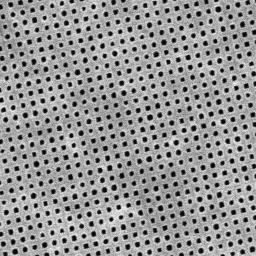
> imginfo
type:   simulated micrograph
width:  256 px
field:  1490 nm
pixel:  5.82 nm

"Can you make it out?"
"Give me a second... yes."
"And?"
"a regular array of holes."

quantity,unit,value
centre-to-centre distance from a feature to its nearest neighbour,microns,0.0572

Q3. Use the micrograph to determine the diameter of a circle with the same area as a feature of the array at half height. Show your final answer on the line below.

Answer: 0.0286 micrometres